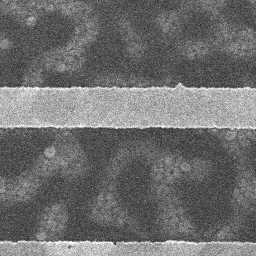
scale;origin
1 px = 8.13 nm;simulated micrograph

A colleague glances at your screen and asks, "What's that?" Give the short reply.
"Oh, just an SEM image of one or a few lines or trenches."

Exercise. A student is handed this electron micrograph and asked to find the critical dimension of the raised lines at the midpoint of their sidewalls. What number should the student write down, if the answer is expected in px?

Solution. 39.8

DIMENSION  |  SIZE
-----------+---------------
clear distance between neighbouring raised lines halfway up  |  0.929 um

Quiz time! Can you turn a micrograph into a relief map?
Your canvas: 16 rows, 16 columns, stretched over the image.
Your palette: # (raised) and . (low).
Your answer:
................
................
................
................
................
###.####.###....
################
################
................
................
................
................
................
................
................
################